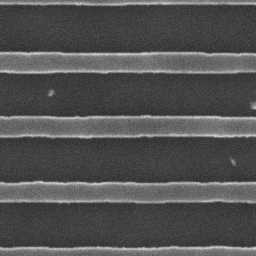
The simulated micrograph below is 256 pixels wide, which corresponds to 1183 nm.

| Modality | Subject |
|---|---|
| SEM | lines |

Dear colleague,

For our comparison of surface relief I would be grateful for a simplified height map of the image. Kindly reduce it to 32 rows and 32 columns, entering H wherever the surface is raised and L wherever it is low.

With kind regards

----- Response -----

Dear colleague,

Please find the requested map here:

LLLLLHLLLHHHHHHHLLLLLLLLLLLLLLLH
LLLLLLLLLLLLLLLLLLLLLLLLLLLLLLLL
LLLLLLLLLLLLLLLLLLLLLLLLLLLLLLLL
LLLLLLLLLLLLLLLLLLLLLLLLLLLLLLLL
LLLLLLLLLLLLLLLLLLLLLLLLLLLLLLLL
LLLLLLLLLLLLLLLLLLLLLLLLLLLLLLLL
LLLLLLLLLLLLLLLLLLLLLLLLLLLLLLLL
HHHHHHHHHHHHHHHHHHHHHHHHHHHHHHHH
HHHHHHHHHHHHHHHHHHHHHHHHHHHHHHHH
LLLLLLLLLLLLLLLLLLLLLLLLLLLLLLLL
LLLLLLLLLLLLLLLLLLLLLLLLLLLLLLLL
LLLLLLLLLLLLLLLLLLLLLLLLLLLLLLLL
LLLLLLLLLLLLLLLLLLLLLLLLLLLLLLLL
LLLLLLLLLLLLLLLLLLLLLLLLLLLLLLLL
LLLLLLLLLLLLLLLLLLLLLLLLLLLLLLLL
HHHHHHHHHHHHHHHHHHHHHHHHHHHHHHHH
HHHHHHHHHHHHHHHHHHHHHHHHHHHHHHHH
LLLLLLLLLLLLLLLLLLLLLLLLLLLLLLLL
LLLLLLLLLLLLLLLLLLLLLLLLLLLLLLLL
LLLLLLLLLLLLLLLLLLLLLLLLLLLLLLLL
LLLLLLLLLLLLLLLLLLLLLLLLLLLLLLLL
LLLLLLLLLLLLLLLLLLLLLLLLLLLLLLLL
LLLLLLLLLLLLLLLLLLLLLLLLLLLLLLLL
HHHHHHHHHHHHHHHHHHHHHHHHHHHHHHHH
HHHHHHHHHHHHHHHHHHHHHHHHHHHHHHHH
LLLLLLLLLLLLLLLLLLLLLLLLLLLLLLLL
LLLLLLLLLLLLLLLLLLLLLLLLLLLLLLLL
LLLLLLLLLLLLLLLLLLLLLLLLLLLLLLLL
LLLLLLLLLLLLLLLLLLLLLLLLLLLLLLLL
LLLLLLLLLLLLLLLLLLLLLLLLLLLLLLLL
LLLLLLLLLLLLLLLLLLLLLLLLLLLLLLLL
HHHHHHHHHHHHHHHHHHHHHHHHHHHHHHHH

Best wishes